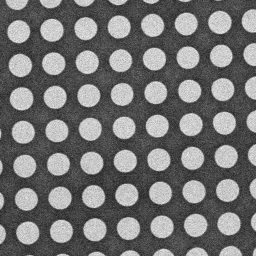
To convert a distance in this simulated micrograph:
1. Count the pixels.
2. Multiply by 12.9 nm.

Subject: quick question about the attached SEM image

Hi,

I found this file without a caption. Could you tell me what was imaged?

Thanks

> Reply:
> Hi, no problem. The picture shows an array of small figures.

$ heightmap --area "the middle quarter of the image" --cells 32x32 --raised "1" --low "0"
00011111000011111000011110000111
00001111000001100000000000000000
00000000000000000000000000000000
00000000000000000000000000000000
00000000000000000000000000000011
00000110000001110000011110000111
00001111100011111000111111000111
00001111100011111000111111000111
00001111100011111000111110000111
00001111000011111000001100000000
00000110000000000000000000000000
00000000000000000000000000000000
00000000000000000000000000000000
00000000000000110000011110000111
00001111100001111000011111000111
10001111100011111100011111000111
10001111100011111100011111000111
10001111100001111000011110000011
00000111000000110000000000000000
00000000000000000000000000000000
00000000000000000000000000000000
00000000000000000000001110000011
00000111000001111000011111000011
10000111100001111100011111000011
10001111110001111100011111000011
10001111110001111100011111000011
10000111100001111000000110000000
00000000000000000000000000000000
00000000000000000000000000000000
00000000000000000000000000000001
00000000000000111000001111000011
10000111110001111100001111100011